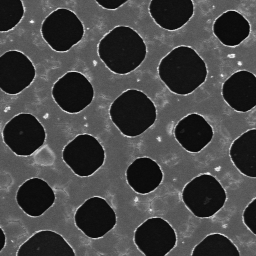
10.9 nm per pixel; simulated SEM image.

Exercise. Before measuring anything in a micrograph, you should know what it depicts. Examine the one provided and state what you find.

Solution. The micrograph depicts a regular array of holes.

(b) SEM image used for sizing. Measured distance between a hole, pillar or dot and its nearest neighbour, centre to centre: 688 nm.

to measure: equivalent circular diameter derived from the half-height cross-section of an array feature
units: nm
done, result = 436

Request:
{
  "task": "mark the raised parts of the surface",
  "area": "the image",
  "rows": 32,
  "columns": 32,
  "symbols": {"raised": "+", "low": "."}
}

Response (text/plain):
...+++++++++...++++.....++++++++
...++++..++++++++++.....++++.+++
...+++....+++++++++.....+++....+
..+++.....++++..+++++.+++++....+
+++++.....+++....++++++++++....+
++++++...+++......++++++++++..++
+.++++++++++......+++...++++++++
....+++++++++.....++.....+++++++
....++++++++++...+++......++++++
....++++..++++++++++......+++...
....+++....++++++++++....+++....
+.+++++.....++++..++++..++++....
+++++++.....++.....+++++++++....
++++++++...+++.....++++++++++...
++..++++++++++.....++++..+++++++
+....+++++++++.....+++....++++++
......+++++++++...++++.....++++.
+.....+++...++++++++++....+++...
+....+++.....++++++++++..++++...
++++++++.....++++++++++++++++...
++++++++.....+++....+++++++++...
+++++++++...++++....++++++++++..
++++.+++++++++++....++++...+++++
++....+++++++++++..++++.....++++
++.....++++++++++++++++.....++++
++.....+++...++++++++++.....+++.
+++...++++....++++++++++...++++.
+++++++++.....++++..++++++++++..
++++++++++....+++....++++++++++.
.+++....+++..++++.....++++..++++
.++.....+++++++++.....+++....+++
++.......+++++++++...+++......++